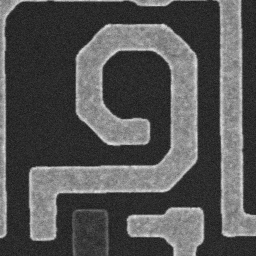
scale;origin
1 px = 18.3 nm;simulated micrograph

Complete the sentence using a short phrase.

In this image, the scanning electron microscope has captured wiring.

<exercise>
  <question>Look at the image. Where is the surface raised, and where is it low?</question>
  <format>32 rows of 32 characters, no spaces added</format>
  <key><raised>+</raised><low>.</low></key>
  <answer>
++................+++.......++..
+...........................++..
+...........................++..
.............++++++++.......++..
............++++++++++......++..
...........++++++++++++.....++..
..........++++......++++....++..
..........+++........+++....++..
..........+++........+++....++..
..........+++........+++....++..
..........+++........+++....++..
..........+++........+++....++..
+.........+++........++++...++..
+.........+++........++++...++..
+.........++++.......++++...++..
+..........+++++++....+++...++..
+...........+++++++...+++...++..
+............+++++....+++...++..
+....................++++...++..
+....................++++...++..
+...................++++....++..
+...+++++++++++++++++++.....++..
+...++++++++++++++++++......++..
+...+++++++++++++++++.......++..
+...+++.....................++..
+...+++.....................++..
+...+++...+++........++++...++..
+...+++..++++...+++++++++...++++
+...+++..++++...+++++++++...++++
....+++..++++.......+++++.......
.........++++........++++.......
.........++++.........++........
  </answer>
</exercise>